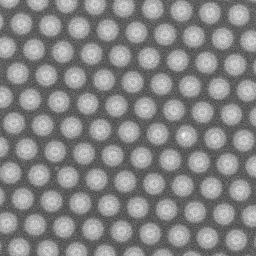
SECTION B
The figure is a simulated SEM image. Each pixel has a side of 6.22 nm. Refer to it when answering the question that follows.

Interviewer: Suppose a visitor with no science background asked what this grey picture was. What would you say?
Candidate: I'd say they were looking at an array of small figures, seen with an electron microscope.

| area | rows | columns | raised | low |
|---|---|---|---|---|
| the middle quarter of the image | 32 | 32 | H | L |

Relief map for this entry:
LLLLLLLLLLLLLHHLLLLHHHHLLLHHHHHL
LHHHLLLLLLLLLLLLLLLLLLLLLLLHHHLL
HHHHHLLLHHHHLLLLHHHLLLLLLLLLLLLL
HHHHHLLHHHHHHLLHHHHHLLHHHHLLLLHH
HHHHHLLLHHHHHLLHHHHHLLHHHHHLLHHH
LHHHLLLLHHHHLLLHHHHHLLHHHHHLLHHH
LLLLLLLLLLHLLLLHHHHLLLHHHHLLLHHH
LLLLLHLLLLLLLLLLLLLLLLLHHLLLLLHH
HLLLHHHHLLLLHHHLLLLLHLLLLLLLLLLL
HLLHHHHHLLLHHHHHLLHHHHLLLLHHHLLL
HLLHHHHHLLLHHHHHLLHHHHHLLHHHHHLL
LLLLHHHHLLLHHHHLLLHHHHHLLHHHHHLL
LLLLLLLLLLLHHHHLLLHHHHLLLHHHHHLL
LHHLLLLLLLLLLLLLLLLLHLLLLLHHHLLL
HHHHLLLHHHHLLLLHLLLLLLLLLLLLLLLL
HHHHLLLHHHHLLLHHHHLLLLHHHLLLLLLL
HHHHLLLHHHHHLLHHHHHLLHHHHHLLLHHH
HHHHLLLHHHHLLLHHHHHLLHHHHHLLHHHH
LLLLLLLLHHHLLLHHHHLLLHHHHHLLHHHH
LLLLLLLLLLLLLLLLLLLLLLHHHLLLHHHH
LLLHHHHLLLLHHLLLLLLLLLLLLLLLLLHL
LLLHHHHLLLHHHHLLLLHHHLLLLLHLLLLL
LLHHHHHLLLHHHHHLLHHHHHLLHHHHHLLL
LLLHHHHLLLHHHHHLLHHHHHLLHHHHHLLH
LLLHHHLLLLHHHHLLLHHHHHLLHHHHHLLH
LLLLLLLLLLLLLLLLLLHHHLLLHHHHHLLH
HHHLLLLHHLLLLLLLLLLLLLLLLLHLLLLL
HHHLLLHHHHLLLLHHHLLLLLHLLLLLLLLL
HHHLLLHHHHHLLHHHHHLLHHHHHLLLHHHL
HHHLLLHHHHHLLHHHHHLLHHHHHLLHHHHH
HHLLLLHHHHLLLHHHHHLLHHHHHLLHHHHH
LLLLLLLLLLLLLLHHHLLLHHHHLLLHHHHH